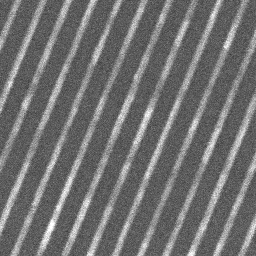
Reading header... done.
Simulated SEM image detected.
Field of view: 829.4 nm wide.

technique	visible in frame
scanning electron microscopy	parallel lines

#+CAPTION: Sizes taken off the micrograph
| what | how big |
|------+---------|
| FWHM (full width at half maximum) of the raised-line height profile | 0.0146 um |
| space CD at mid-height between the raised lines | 60.6 nm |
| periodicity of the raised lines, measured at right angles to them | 23.4 px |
